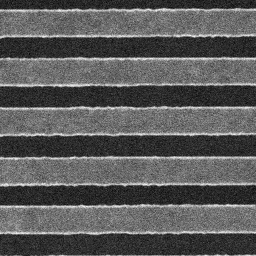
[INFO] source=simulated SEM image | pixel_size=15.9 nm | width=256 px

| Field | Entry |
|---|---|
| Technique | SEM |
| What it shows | lines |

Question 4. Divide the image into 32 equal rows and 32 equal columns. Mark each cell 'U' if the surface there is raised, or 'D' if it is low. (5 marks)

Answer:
DDDDDDDDDDDDDDDDDDDDDDDDDDDDDDDD
UUUUUUUUUUUUUUUUUUUUUUUUUUUUUUUU
UUUUUUUUUUUUUUUUUUUUUUUUUUUUUUUU
UUUUUUUUUUUUUUUUUUUUUUUUUUUUUUUU
UUUUUUUUUUUUUUUUUUUDDDUUUUDDUUDD
DDDDDDDDDDDDDDDDDDDDDDDDDDDDDDDD
DDDDDDDDDDDDDDDDDDDDDDDDDDDDDDDD
UUUUUUUUUUUUUUUUUUUUUUUUUUUUUUUU
UUUUUUUUUUUUUUUUUUUUUUUUUUUUUUUU
UUUUUUUUUUUUUUUUUUUUUUUUUUUUUUUU
UUUUUUUUUUUUUUUUUUUUUUUUUUUUUUUU
DDDDDDDDDDDDDDDDDDDDDDDDDDDDDDDD
DDDDDDDDDDDDDDDDDDDDDDDDDDDDDDDD
DDDDDDDDDUUDDUUUUDDUUDUUUUUUUUUU
UUUUUUUUUUUUUUUUUUUUUUUUUUUUUUUU
UUUUUUUUUUUUUUUUUUUUUUUUUUUUUUUU
UUUUUUUUUUUUUUUUUUUUUUUUUUUUUUUU
DDDDDDDDDDDDDDDDDDDDDDDDDDDDDDDD
DDDDDDDDDDDDDDDDDDDDDDDDDDDDDDDD
DDDDDDDDDDDDDDDDDDDDDDDDDDDDDDDD
UUUUUUUUUUUUUUUUUUUUUUUUUUUUUUUU
UUUUUUUUUUUUUUUUUUUUUUUUUUUUUUUU
UUUUUUUUUUUUUUUUUUUUUUUUUUUUUUUU
DDDDDDDDDDDDDDDDDDDDDDDDDDDDDDDD
DDDDDDDDDDDDDDDDDDDDDDDDDDDDDDDD
DDDDDDDDDDDDDDDDDDDDDDDDDDDDDDDD
UUUUUUUUUUUUUUUUUUUUUUUUUUUUUUUU
UUUUUUUUUUUUUUUUUUUUUUUUUUUUUUUU
UUUUUUUUUUUUUUUUUUUUUUUUUUUUUUUU
DDDDDDDDDDDDDDDDDDDDDDDDDDDDDDDD
DDDDDDDDDDDDDDDDDDDDDDDDDDDDDDDD
DDDDDDDDDDDDDDDDDDDDDDDDDDDDDDDD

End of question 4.